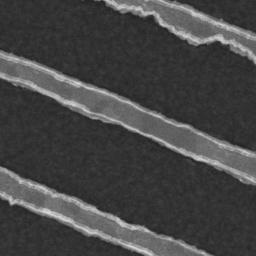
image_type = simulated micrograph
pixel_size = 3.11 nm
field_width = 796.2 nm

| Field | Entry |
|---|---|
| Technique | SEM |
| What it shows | one or a few lines or trenches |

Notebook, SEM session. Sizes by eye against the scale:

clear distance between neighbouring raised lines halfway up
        276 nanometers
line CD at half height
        67.2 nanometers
